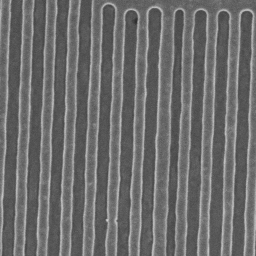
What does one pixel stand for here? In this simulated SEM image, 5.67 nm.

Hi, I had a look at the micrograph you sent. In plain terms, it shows parallel lines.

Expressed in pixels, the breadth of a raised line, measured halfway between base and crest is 10.2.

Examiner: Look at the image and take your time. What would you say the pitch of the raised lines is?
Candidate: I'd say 130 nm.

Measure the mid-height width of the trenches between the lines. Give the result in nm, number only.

71.5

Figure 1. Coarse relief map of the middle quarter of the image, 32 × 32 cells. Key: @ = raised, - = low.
-@@----@@---@@@---@@@---@@@--@@@
-@@----@@---@@@---@@@---@@@--@@@
-@@----@@---@@@---@@@---@@@---@@
-@@----@@---@@@---@@----@@@---@@
-@@---@@@---@@@---@@----@@@---@@
-@@---@@@---@@----@@----@@@--@@@
-@@---@@@---@@----@@----@@@--@@@
-@@---@@@---@@@---@@@---@@@--@@@
@@@---@@@---@@@---@@----@@@--@@@
@@@---@@@---@@@---@@----@@@---@@
-@@---@@@---@@----@@----@@@---@@
-@@---@@@---@@----@@----@@@--@@@
@@@---@@@---@@----@@----@@@--@@@
@@@---@@@---@@----@@---@@@@--@@@
@@@---@@@---@@----@@---@@@@--@@@
@@@---@@@---@@---@@@---@@@@--@@@
@@@---@@@---@@---@@@---@@@@--@@@
@@@---@@----@@----@@---@@@---@@@
@@@---@@----@@----@@---@@@@--@@@
@@@---@@---@@@----@@---@@@@--@@-
@@----@@---@@@----@@---@@@---@@-
@@----@@----@@---@@@---@@@---@@-
@@----@@----@@---@@@---@@@---@@-
@@----@@---@@@---@@@---@@@---@@-
@@----@@---@@@---@@@---@@@---@@-
@@---@@@---@@@---@@----@@@---@@-
@@---@@@---@@@---@@----@@@---@@-
@@---@@@---@@@---@@----@@@---@@-
@@---@@@---@@@---@@----@@@---@@-
@@---@@@---@@@---@@----@@@---@@-
@@----@@---@@@---@@----@@@---@@-
@@---@@@---@@----@@----@@@---@@-